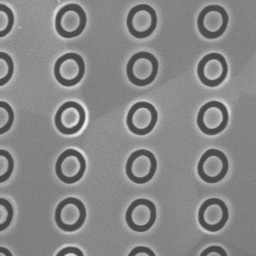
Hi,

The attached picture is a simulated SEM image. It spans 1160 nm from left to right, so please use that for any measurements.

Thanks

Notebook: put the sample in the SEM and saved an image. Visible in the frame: a regular array of ring-shaped grooves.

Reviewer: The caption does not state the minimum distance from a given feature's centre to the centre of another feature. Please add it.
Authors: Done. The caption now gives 0.218 micrometres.